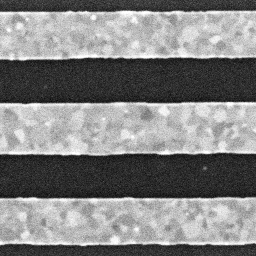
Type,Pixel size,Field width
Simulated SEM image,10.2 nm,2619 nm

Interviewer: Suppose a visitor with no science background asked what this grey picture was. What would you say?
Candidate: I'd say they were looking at lines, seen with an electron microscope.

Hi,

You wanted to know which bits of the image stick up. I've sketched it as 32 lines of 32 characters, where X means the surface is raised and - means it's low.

--------------------------------
---------------XX---------XXXXXX
XXXXXXXXXXXXXXXXXXXXXXXXXXXXXXXX
XXXXXXXXXXXXXXXXXXXXXXXXXXXXXXXX
XXXXXXXXXXXXXXXXXXXXXXXXXXXXXXXX
XXXXXXXXXXXXXXXXXXXXXXXXXXXXXXXX
XXXXXXXXXXXXXXXXXXXXXXXXXXXXXXXX
--------------------------------
--------------------------------
--------------------------------
--------------------------------
--------------------------------
--------------------------------
XXXXXXXXXXXXXXXXXXXXXXXXXXXXXXXX
XXXXXXXXXXXXXXXXXXXXXXXXXXXXXXXX
XXXXXXXXXXXXXXXXXXXXXXXXXXXXXXXX
XXXXXXXXXXXXXXXXXXXXXXXXXXXXXXXX
XXXXXXXXXXXXXXXXXXXXXXXXXXXXXXXX
XXXXXXXXXXXXXXXXXXXXXXXXXXXXXXXX
--------------------------------
--------------------------------
--------------------------------
--------------------------------
--------------------------------
--------------------------------
XXXXXXXXXXXXXXXXXXXXXXXXXXXXXXXX
XXXXXXXXXXXXXXXXXXXXXXXXXXXXXXXX
XXXXXXXXXXXXXXXXXXXXXXXXXXXXXXXX
XXXXXXXXXXXXXXXXXXXXXXXXXXXXXXXX
XXXXXXXXXXXXXXXXXXXXXXXXXXXXXXXX
----XXXXXXXXXXXX----XX-XXXXXXX--
--------------------------------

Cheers